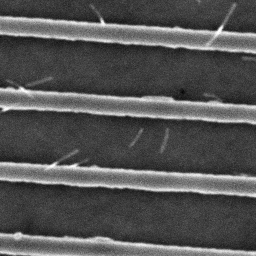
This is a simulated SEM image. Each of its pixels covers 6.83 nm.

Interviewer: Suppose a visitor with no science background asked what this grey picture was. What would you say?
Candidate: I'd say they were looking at lines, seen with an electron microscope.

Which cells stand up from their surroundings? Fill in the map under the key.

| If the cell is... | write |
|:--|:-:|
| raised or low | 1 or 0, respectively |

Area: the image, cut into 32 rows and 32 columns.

00000000000000000000000000000000
00000000000000000000000000000000
11111110000000000000000000000000
11111111111111111111000000000000
00001111111111111111111111111111
00000000000000000011111111111111
00000000000000000000000000000001
00000000000000000000000000000000
00000000000000000000000000000000
00000000000000000000000000000000
00000000000000000000000000000000
11111000000000000000000000000000
11111111111111111111100000000000
11111111111111111111111111111111
00000000000000000111111111111111
00000000000000000000000000000000
00000000000000000000000000000000
00000000000000000000000000000000
00000000000000000000000000000000
00000000000000000000000000000000
11000000000000000000000000000000
11111111111111111110000000000000
01111111111111111111111111111111
00000000000000000111111111111111
00000000000000000000000000000001
00000000000000000000000000000000
00000000000000000000000000000000
00000000000000000000000000000000
00000000000000000000000000000000
11110000000000000000000000000000
11111111111111111100000000000000
11111111111111111111111111111100